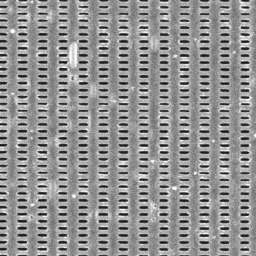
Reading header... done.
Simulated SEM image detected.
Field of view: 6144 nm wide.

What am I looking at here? a regular array of holes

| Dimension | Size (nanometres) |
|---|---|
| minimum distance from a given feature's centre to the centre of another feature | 167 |